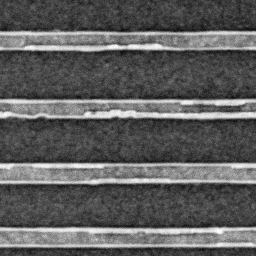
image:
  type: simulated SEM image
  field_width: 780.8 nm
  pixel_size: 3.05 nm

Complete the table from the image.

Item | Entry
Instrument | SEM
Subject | one or a few lines or trenches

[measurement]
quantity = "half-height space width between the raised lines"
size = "144 nanometres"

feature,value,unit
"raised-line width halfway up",51.9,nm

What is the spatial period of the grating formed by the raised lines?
65.8 px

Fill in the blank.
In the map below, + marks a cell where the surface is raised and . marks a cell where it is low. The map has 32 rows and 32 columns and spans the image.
................................
................................
................................
................................
++++++++++++++++++++++++++++++++
++++++++++++++++++++++++++++++++
................................
................................
................................
................................
................................
................................
................................
++++++++++++++++++++++++++++++++
+..++.++++++++.+.+++++++++++++++
................................
................................
................................
................................
................................
................................
++++++++++++++++++++++++++++++++
++++++++++++++++++++++++++++++++
................................
................................
................................
................................
................................
................................
++++++++++++++++++++++++++++++++
++++++++++++++++++++++++++++++++
................................